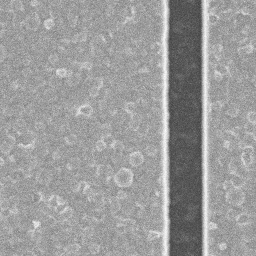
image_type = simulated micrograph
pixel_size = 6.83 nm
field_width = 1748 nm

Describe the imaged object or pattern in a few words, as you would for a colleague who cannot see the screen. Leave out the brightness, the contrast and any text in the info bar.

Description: one or a few lines or trenches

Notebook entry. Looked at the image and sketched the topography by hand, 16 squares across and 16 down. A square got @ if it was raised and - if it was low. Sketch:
@@@@@@@@@@---@@@
@@@@@@@@@@---@@@
@@@@@@@@@@---@@@
@@@@@@@@@@---@@@
@@@@@@@@@@---@@@
@@@@@@@@@@---@@@
@@@@@@@@@@---@@@
@@@@@@@@@@---@@@
@@@@@@@@@@---@@@
@@@@@@@@@@---@@@
@@@@@@@@@@---@@@
@@@@@@@@@@---@@@
@@@@@@@@@@---@@@
@@@@@@@@@@@--@@@
@@@@@@@@@@---@@@
@@@@@@@@@@---@@@